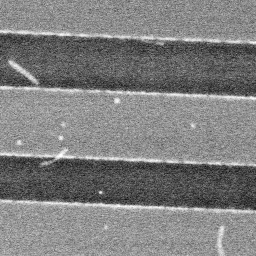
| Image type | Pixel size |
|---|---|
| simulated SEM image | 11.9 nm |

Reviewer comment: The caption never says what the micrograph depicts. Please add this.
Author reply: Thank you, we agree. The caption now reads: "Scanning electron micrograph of lines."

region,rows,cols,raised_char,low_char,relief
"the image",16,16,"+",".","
++++++++++++++++
++++++++++++++++
...........+++++
................
................
+...............
++++++++++++++++
++++++++++++++++
++++++++++++++++
++++++++++++++++
................
................
................
++++++++++++++++
++++++++++++++++
++++++++++++++++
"